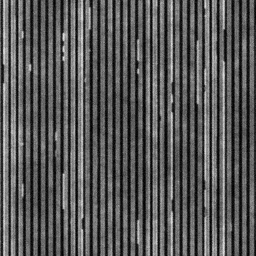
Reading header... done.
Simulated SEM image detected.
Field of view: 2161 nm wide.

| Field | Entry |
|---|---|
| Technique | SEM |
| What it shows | parallel lines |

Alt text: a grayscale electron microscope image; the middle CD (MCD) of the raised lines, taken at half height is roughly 31.6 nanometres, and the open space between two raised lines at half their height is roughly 31.6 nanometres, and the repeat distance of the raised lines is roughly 62.9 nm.